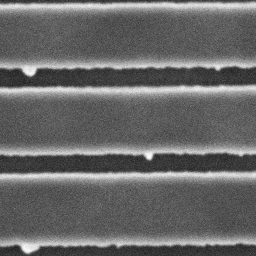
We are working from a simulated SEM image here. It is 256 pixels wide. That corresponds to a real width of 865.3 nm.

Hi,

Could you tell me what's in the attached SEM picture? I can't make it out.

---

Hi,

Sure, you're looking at lines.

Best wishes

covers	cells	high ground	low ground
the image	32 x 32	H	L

LLLLLLLLLLLLLLLLLLLLLLLLLLLLLLLL
HHHHHHHHHHHHHHHHHHHHHHHHHHHHHHHH
HHHHHHHHHHHHHHHHHHHHHHHHHHHHHHHH
HHHHHHHHHHHHHHHHHHHHHHHHHHHHHHHH
HHHHHHHHHHHHHHHHHHHHHHHHHHHHHHHH
HHHHHHHHHHHHHHHHHHHHHHHHHHHHHHHH
HHHHHHHHHHHHHHHHHHHHHHHHHHHHHHHH
HHHHHHHHHHHHHHHHHHHHHHHHHHHHHHHH
LHHHHLHHHLHHLLHHLLLLLLLLLLLLLLLL
LLLLLLLLLLLLLLLLLLLLLLLLLLLLLLLL
LLLLLLLLLLLLLLLLLLLLLLLLLLLLLLLL
HHHHHHHHHHHHHHHHHHHHHHHHHHHHHHHH
HHHHHHHHHHHHHHHHHHHHHHHHHHHHHHHH
HHHHHHHHHHHHHHHHHHHHHHHHHHHHHHHH
HHHHHHHHHHHHHHHHHHHHHHHHHHHHHHHH
HHHHHHHHHHHHHHHHHHHHHHHHHHHHHHHH
HHHHHHHHHHHHHHHHHHHHHHHHHHHHHHHH
HHHHHHHHHHHHHHHHHHHHHHHHHHHHHHHH
HHHHHHHHHHHHHHHHHHHHHHHHHHHHHHHH
LLLLLLLLLLLLLLLLLLLLLLLLLLLLLLLL
LLLLLLLLLLLLLLLLLLLLLLLLLLLLLLLL
LLLLLLLLLLLLLLLLLLLLLLLLLLLLLLLL
HHHHHHHHHHHHHHHHHHHHHHHHHHHHHHHH
HHHHHHHHHHHHHHHHHHHHHHHHHHHHHHHH
HHHHHHHHHHHHHHHHHHHHHHHHHHHHHHHH
HHHHHHHHHHHHHHHHHHHHHHHHHHHHHHHH
HHHHHHHHHHHHHHHHHHHHHHHHHHHHHHHH
HHHHHHHHHHHHHHHHHHHHHHHHHHHHHHHH
HHHHHHHHHHHHHHHHHHHHHHHHHHHHHHHH
HHHHHHHHHHHHHHHHHHHHHHHHHHHHHHHH
HHHHHHHHHHHHHHHHHHHHHHHHHHHHHLLL
LLLLLLLLLLLLLLLLLLLLLLLLLLLLLLLL